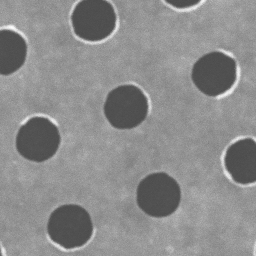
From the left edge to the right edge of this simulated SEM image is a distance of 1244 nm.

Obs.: holes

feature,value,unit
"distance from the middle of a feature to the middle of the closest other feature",456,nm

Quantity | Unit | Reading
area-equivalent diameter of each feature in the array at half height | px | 45.1